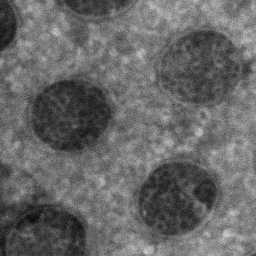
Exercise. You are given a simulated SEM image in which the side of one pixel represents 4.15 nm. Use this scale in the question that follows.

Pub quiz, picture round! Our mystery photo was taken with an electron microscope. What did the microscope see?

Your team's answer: raised bodies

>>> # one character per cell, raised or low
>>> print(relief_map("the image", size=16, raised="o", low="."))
o...oooo........
o...............
o..........ooo..
..........ooooo.
..........ooooo.
...ooo....oooo..
..ooooo.....o...
..ooooo.........
..oooo..........
....o...........
..........ooo...
.........ooooo..
.........ooooo..
.oooo....oooo...
.oooo.....oo....
ooooo...........